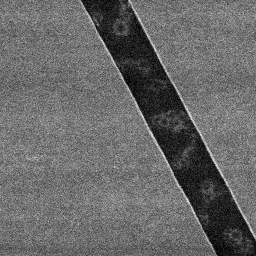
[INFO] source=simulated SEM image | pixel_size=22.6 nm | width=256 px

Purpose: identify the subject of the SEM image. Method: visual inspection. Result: one or a few lines or trenches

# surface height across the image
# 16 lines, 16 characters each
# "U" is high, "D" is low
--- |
UUUUUDDDUUUUUUUU
UUUUUUDDDUUUUUUU
UUUUUUDDDUUUUUUU
UUUUUUUDDDUUUUUU
UUUUUUUDDDUUUUUU
UUUUUUUUDDDUUUUU
UUUUUUUUUDDDUUUU
UUUUUUUUUDDDUUUU
UUUUUUUUUUDDDUUU
UUUUUUUUUUDDDUUU
UUUUUUUUUUUDDDUU
UUUUUUUUUUUDDDUU
UUUUUUUUUUUUDDDU
UUUUUUUUUUUUDDDU
UUUUUUUUUUUUUDDD
UUUUUUUUUUUUUDDD